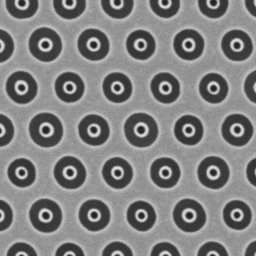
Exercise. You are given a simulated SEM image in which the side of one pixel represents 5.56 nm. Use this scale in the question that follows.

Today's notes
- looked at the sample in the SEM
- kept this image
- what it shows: a regular array of ring-shaped grooves with a dot in the middle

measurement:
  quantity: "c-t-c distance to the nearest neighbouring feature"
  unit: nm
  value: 266